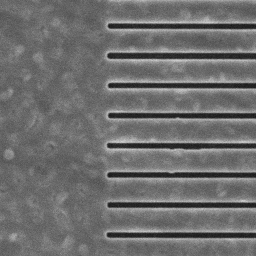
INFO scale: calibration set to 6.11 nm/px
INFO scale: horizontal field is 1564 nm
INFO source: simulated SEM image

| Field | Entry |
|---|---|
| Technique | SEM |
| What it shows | parallel lines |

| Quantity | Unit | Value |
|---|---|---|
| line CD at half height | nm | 149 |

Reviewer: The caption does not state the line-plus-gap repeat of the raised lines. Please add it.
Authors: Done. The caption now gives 29.8 px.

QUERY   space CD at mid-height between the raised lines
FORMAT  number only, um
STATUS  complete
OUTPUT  0.0344